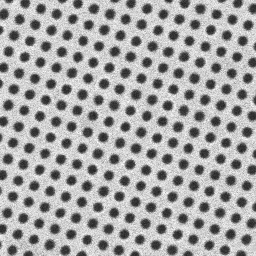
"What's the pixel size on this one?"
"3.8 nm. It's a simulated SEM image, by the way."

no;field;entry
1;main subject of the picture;a regular array of holes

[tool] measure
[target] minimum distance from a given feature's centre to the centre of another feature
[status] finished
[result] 63 nm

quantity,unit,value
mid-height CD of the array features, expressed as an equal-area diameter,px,9.82